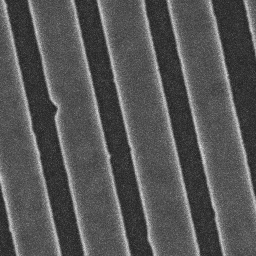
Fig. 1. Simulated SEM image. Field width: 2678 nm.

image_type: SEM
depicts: one or a few lines or trenches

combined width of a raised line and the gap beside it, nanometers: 704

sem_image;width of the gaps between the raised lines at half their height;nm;252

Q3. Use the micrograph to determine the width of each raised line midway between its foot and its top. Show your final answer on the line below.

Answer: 449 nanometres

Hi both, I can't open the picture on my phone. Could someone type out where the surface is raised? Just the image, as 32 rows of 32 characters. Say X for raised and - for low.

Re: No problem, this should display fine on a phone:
X---XXXXX---XXXXXX---XXXXX-----X
X---XXXXXX---XXXXX---XXXXXX----X
X---XXXXXX---XXXXX----XXXXX----X
X---XXXXXX---XXXXXX---XXXXX----X
X----XXXXX---XXXXXX---XXXXX-----
XX---XXXXX---XXXXXX---XXXXXX----
XX---XXXXXX---XXXXX---XXXXXX----
XX---XXXXXX---XXXXX----XXXXX----
XX----XXXXX---XXXXXX---XXXXX----
XXX---XXXXX---XXXXXX---XXXXX----
XXX---XXXXXX---XXXXX---XXXXXX---
XXX---XXXXXX---XXXXX----XXXXX---
XXX---XXXXXX---XXXXXX---XXXXX---
XXX----XXXXX---XXXXXX---XXXXX---
XXXX---XXXXX---XXXXXX---XXXXXX--
XXXX---XXXXXX---XXXXX---XXXXXX--
XXXX---XXXXXX---XXXXX----XXXXX--
XXXX---XXXXXX---XXXXXX---XXXXX--
XXXXX---XXXXX---XXXXXX---XXXXX--
XXXXX---XXXXXX---XXXXX---XXXXXX-
XXXXX---XXXXXX---XXXXX---XXXXXX-
XXXXX---XXXXXX---XXXXXX---XXXXX-
XXXXX----XXXXX---XXXXXX---XXXXX-
XXXXXX---XXXXX---XXXXXX---XXXXX-
-XXXXX---XXXXXX---XXXXX---XXXXXX
-XXXXX---XXXXXX---XXXXXX---XXXXX
-XXXXX---XXXXXX---XXXXXX---XXXXX
-XXXXXX---XXXXX---XXXXXX---XXXXX
-XXXXXX---XXXXXX---XXXXX---XXXXX
--XXXXX---XXXXXX---XXXXX---XXXXX
--XXXXX---XXXXXX---XXXXXX---XXXX
--XXXXX----XXXXX---XXXXXX---XXXX